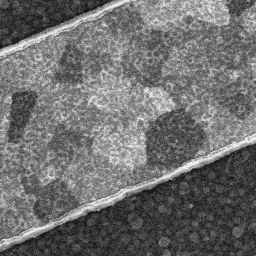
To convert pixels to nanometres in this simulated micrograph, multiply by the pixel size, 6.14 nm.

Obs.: one or a few lines or trenches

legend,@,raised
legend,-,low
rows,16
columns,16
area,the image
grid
-------@@@@@@@@@
-----@@@@@@@@@@@
--@@@@@@@@@@@@@@
@@@@@@@@@@@@@@@@
@@@@@@@@@@@@@@@@
@@@@@@@@@@@@@@@@
@@@@@@@@@@@@@@@@
@@@@@@@@@@@@@@@@
@@@@@@@@@@@@@@@@
@@@@@@@@@@@@@@--
@@@@@@@@@@@-----
@@@@@@@@@-------
@@@@@@@---------
@@@@------------
@@--------------
----------------